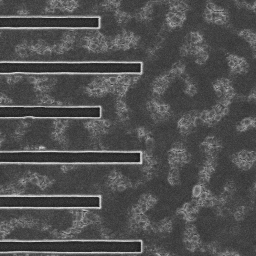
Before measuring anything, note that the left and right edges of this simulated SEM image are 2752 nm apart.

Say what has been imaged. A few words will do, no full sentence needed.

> parallel lines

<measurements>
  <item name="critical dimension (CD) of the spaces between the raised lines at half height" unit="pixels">11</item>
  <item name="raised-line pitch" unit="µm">0.481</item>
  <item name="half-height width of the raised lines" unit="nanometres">364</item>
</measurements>